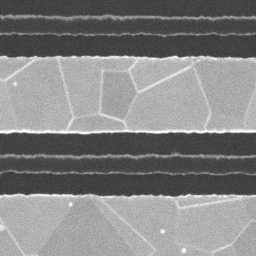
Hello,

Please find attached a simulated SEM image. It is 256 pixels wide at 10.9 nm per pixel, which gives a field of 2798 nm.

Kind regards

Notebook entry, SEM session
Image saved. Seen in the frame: lines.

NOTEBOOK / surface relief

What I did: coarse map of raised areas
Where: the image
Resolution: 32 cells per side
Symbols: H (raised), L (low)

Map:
LLLLLLLLLLLLLLLLLLLLLLLLLLLLLLLL
LLLLLLLLLLLLLLLLLLLLLLLLLLLLLLLL
HHHHHHHHHHHHHHHHHHHHHHHHHHHHHHHH
HHHHHHHHHHHHHHHHHHHHHHHHHHHHHHHH
LLLLLLLLLLLLLLLLLLLLHLLLLLLLLLLL
LLLLLLLLLLLLLLLLLLLLLLLLLLLLLLLL
LLLLLLLLLLLLLLLLLLLLLLLLLLLLLLLL
HHHHHHHHHHHHHHHHHHHHHHHHHHHHHHHH
HHHHHHHHHHHHHHHHHHHHHHHHHHHHHHHH
HHHHHHHHHHHHHHHHHHHHHHHHHHHHHHHH
HHHHHHHHHHHHHHHHHHHHHHHHHHHHHHHH
HHHHHHHHHHHHHHHHHHHHHHHHHHHHHHHH
HHHHHHHHHHHHHHHHHHHHHHHHHHHHHHHH
HHHHHHHHHHHHHHHHHHHHHHHHHHHHHHHH
HHHHHHHHHHHHHHHHHHHHHHHHHHHHHHHH
HHHHHHHHHHHHHHHHHHHHHHHHHHHHHHHH
HHLHHHHHHHHHHLHLLHHHHLLHHHLHLLLL
LLLLLLLLLLLLLLLLLLLLLLLLLLLLLLLL
LLLLLLLLLLLLLLLLLLLLLLLLLLLLLLLL
LLLLLLLLLLLLLLLHLLHHLHHLLLLLLLLL
HHHHHHHHHHHHHHHHHHHHHHHHHHHHHHHH
HLHHHHHHHHHHHHHHHHHHHHHHHHHHHHHH
LLLLLLLLLLLLLLLLLLLLLLLLLLLLLLLL
LLLLLLLLLLLLLLLLLLLLLLLLLLLLLLLL
HHHHHHHHHHHHLLLLLHHHHLLHHHHHHHHH
HHHHHHHHHHHHHHHHHHHHHHHHHHHHHHHH
HHHHHHHHHHHHHHHHHHHHHHHHHHHHHHHH
HHHHHHHHHHHHHHHHHHHHHHHHHHHHHHHH
HHHHHHHHHHHHHHHHHHHHHHHHHHHHHHHH
HHHHHHHHHHHHHHHHHHHHHHHHHHHHHHHH
HHHHHHHHHHHHHHHHHHHHHHHHHHHHHHHH
HHHHHHHHHHHHHHHHHHHHHHHHHHHHHHHH